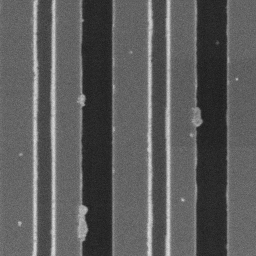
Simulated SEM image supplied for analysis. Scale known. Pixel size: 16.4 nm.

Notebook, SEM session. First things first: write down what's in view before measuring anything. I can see lines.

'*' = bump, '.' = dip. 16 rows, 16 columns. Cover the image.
*****..*****..**
*****..*****..**
*****..*****..**
*****..*****..**
*****..*****..**
*****..*****..**
*****..*****..**
*****..******.**
*****..*****..**
*****..*****..**
*****..*****..**
*****..*****..**
*****..*****..**
*****..*****..**
*****..*****..**
*****..*****..**